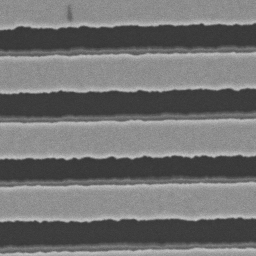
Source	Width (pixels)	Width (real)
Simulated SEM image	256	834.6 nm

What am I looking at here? lines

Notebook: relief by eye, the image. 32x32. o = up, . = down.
oooooooooooooooooooooooooooooooo
oooooooooooooooooooooooooooooooo
oooooooooooooooooooooooooooooooo
oo..ooo.........................
................................
................................
oooooooooooooooooooooooooooooooo
oooooooooooooooooooooooooooooooo
oooooooooooooooooooooooooooooooo
oooooooooooooooooooooooooooooooo
oooooooooooooooooooooooooooooooo
ooooooo..oo.o...................
................................
................................
.................o.ooooooooooooo
oooooooooooooooooooooooooooooooo
oooooooooooooooooooooooooooooooo
oooooooooooooooooooooooooooooooo
oooooooooooooooooooooooooooooooo
ooooooooooooooooooooo.ooo.o.o.oo
................................
................................
..............ooo...oooooooooooo
oooooooooooooooooooooooooooooooo
oooooooooooooooooooooooooooooooo
oooooooooooooooooooooooooooooooo
oooooooooooooooooooooooooooooooo
ooooooooooooo.o..oo....oo.......
................................
................................
.............................ooo
oooooooooooooooooooooooooooooooo